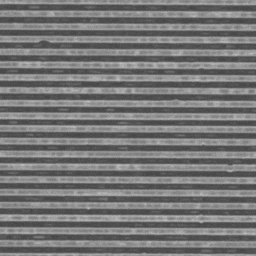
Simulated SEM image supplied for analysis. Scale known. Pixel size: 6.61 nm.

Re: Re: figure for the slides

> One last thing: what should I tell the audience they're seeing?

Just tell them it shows parallel lines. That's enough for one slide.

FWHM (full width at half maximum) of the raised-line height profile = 39.7 nm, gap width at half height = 46.3 nanometers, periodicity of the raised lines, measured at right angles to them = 0.0844 µm